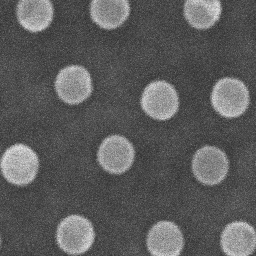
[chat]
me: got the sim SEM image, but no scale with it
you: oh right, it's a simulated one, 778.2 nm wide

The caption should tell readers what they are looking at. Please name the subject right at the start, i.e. raised bodies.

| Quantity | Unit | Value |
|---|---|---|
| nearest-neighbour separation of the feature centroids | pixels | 70.9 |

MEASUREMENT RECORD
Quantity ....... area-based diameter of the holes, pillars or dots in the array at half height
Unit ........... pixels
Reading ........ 36.8